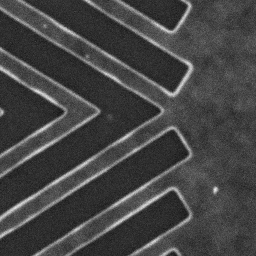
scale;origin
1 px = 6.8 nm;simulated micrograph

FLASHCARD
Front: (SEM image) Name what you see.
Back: groups of lines, slits or small figures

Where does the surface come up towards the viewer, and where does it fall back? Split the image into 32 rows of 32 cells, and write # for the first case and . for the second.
###........#####.......#########
.####........####......#########
..#####.......#####....#########
....####........####..##########
.....#####........##############
.......####........#############
#........####........###########
##........#####........#########
####........####........########
.#####........####.....#########
...####........#####...#########
.....####........####.##########
......#####.......##############
........####........############
........####........############
......####........##############
.....####........####.##########
...####........####....#########
.#####.......#####.....#########
####........####........########
##........####........##########
#........####........###########
.......####........#############
......####........##############
....####........####..##########
...####........###.....#########
.####........####.......########
####.......####........#########
##........####........##########
........####........############
.......####........#############
.....####........####.##########